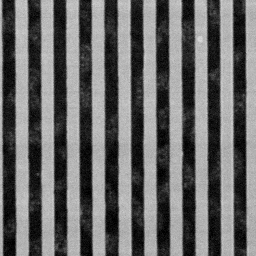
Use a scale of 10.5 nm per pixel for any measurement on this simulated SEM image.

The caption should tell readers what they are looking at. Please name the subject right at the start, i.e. parallel lines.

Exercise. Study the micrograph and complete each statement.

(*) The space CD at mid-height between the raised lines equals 13.9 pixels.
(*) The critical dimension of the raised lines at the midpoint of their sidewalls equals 126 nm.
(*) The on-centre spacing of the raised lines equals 25.6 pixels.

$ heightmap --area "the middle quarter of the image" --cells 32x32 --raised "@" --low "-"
-@@----@@@----@@----@@@----@@---
-@@----@@@----@@----@@@----@@---
-@@----@@@----@@----@@@----@@---
-@@----@@@----@@----@@@----@@---
-@@----@@@----@@----@@@----@@---
-@@----@@@----@@----@@@----@@---
-@@@---@@@----@@----@@@----@@---
-@@@---@@@----@@----@@@----@@---
-@@@---@@@----@@----@@@----@@---
-@@@---@@@----@@----@@@----@@---
-@@@---@@@----@@----@@@----@@---
-@@@---@@@----@@----@@@----@@---
-@@@---@@@----@@----@@@----@@---
-@@@---@@@----@@----@@@----@@---
-@@@---@@@----@@----@@@----@@---
-@@@---@@@----@@----@@@----@@---
-@@@---@@@----@@----@@@----@@---
-@@@---@@@----@@----@@@----@@---
-@@@---@@@----@@----@@@----@@---
-@@@---@@@----@@----@@@----@@---
-@@@---@@@----@@----@@@----@@---
-@@@---@@@----@@----@@@----@@---
-@@@---@@@----@@----@@@----@@@--
-@@@---@@@----@@----@@@----@@---
-@@@---@@@----@@----@@@----@@---
-@@@---@@@----@@----@@@----@@---
-@@@---@@@----@@----@@@----@@---
-@@@---@@@----@@----@@@----@@---
-@@@---@@@----@@----@@@----@@---
-@@@---@@@----@@----@@@----@@---
-@@@---@@@----@@----@@@----@@---
-@@@---@@@----@@----@@@----@@---